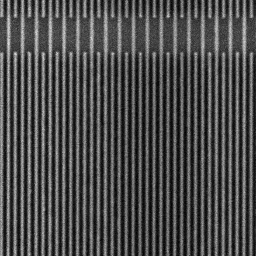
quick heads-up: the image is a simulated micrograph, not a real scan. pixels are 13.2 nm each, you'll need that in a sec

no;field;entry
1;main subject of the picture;parallel lines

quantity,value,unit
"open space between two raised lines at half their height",57.8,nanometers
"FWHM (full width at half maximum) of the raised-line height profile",34.7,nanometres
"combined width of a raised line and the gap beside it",91.7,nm